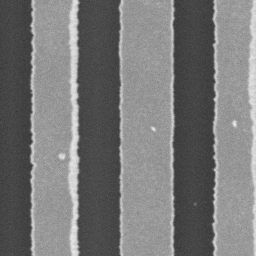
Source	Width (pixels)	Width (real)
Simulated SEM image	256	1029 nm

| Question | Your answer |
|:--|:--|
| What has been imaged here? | lines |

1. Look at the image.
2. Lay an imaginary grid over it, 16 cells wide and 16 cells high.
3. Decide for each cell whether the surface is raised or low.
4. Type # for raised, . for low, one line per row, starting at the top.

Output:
..###...###..###
..###...###..###
..###..####..###
..###..####..###
..###...###..###
..###...###..###
..###...###..###
..###...###..###
..###...###..###
..###...###..###
..###...###..###
..###...###..###
..###...###..###
..###...###..###
..###...###..###
..###...###..###